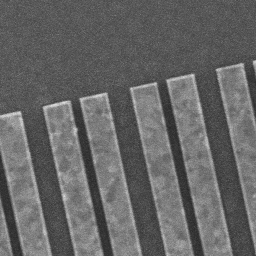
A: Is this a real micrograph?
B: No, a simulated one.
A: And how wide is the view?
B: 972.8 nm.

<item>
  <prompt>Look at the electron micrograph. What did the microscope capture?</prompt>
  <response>parallel lines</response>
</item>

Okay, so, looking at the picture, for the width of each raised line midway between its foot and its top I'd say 0.102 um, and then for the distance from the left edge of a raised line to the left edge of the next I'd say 0.167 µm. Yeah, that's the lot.